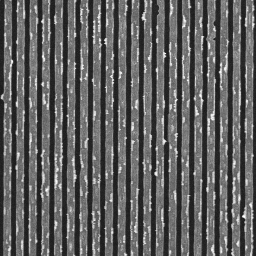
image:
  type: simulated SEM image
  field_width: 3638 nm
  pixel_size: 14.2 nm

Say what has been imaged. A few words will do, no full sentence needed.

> parallel lines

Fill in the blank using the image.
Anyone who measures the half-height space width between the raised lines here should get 85.3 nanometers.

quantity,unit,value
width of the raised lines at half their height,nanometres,99.5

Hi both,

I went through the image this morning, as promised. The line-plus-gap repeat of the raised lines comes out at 181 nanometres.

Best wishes